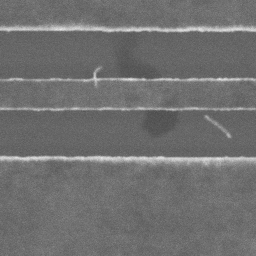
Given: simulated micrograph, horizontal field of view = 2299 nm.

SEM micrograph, lines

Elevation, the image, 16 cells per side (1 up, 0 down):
1111111111111111
1111111111111111
0000000000000000
0000000000000000
0000000000000000
1111111111111111
1111111111111111
0000000000000000
0000000000000000
0000000000000000
1111111111111111
1111111111111111
1111111111111111
1111111111111111
1111111111111111
1111111111111111